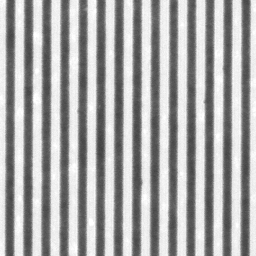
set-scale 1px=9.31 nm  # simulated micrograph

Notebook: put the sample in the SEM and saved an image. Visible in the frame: parallel lines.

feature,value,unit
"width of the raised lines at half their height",110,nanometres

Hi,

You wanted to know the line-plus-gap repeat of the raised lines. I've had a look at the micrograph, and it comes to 168 nanometres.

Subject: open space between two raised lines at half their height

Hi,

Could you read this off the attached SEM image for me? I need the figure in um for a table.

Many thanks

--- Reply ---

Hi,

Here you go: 0.0593